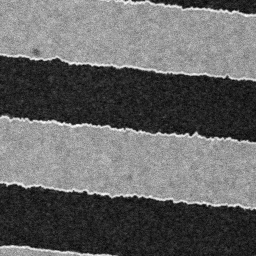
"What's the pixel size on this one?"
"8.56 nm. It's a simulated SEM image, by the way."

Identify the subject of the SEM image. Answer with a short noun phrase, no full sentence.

one or a few lines or trenches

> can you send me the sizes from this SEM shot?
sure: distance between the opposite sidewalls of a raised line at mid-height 558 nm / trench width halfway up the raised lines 529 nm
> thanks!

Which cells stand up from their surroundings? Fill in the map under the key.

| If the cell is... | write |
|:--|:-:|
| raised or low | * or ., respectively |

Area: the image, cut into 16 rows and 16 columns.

***********.....
****************
****************
.***************
..........******
................
................
**..............
************....
****************
****************
.***************
...........*****
................
................
**..............